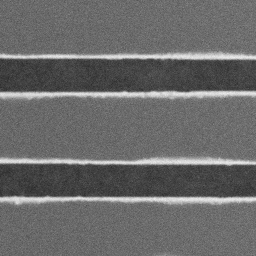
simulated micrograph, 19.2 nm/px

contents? lines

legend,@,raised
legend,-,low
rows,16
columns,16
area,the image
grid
@@@@@@@@@@@@@@@@
@@@@@@@@@@@@@@@@
@@@@@@@@@@@@@@@@
@@@@@@@@@@@@@@@@
----------------
----------------
@@@@@@@@@@@@@@@@
@@@@@@@@@@@@@@@@
@@@@@@@@@@@@@@@@
@@@@@@@@@@@@@@@@
----------------
----------------
@@@@@@@@@@@@@@@@
@@@@@@@@@@@@@@@@
@@@@@@@@@@@@@@@@
@@@@@@@@@@@@@@@@